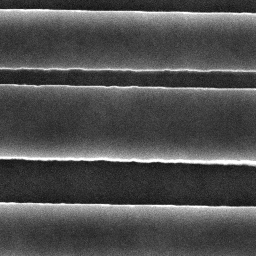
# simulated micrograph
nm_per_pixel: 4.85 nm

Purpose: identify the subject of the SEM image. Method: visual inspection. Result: lines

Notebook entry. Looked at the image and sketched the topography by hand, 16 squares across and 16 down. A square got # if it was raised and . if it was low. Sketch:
................
################
################
################
################
################
################
################
################
################
................
................
................
################
################
################